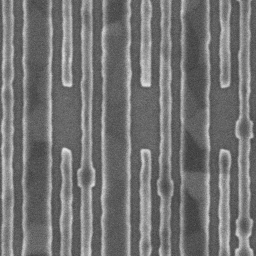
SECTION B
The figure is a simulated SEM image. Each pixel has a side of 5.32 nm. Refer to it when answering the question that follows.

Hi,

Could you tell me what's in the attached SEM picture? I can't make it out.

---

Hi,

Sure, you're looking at wiring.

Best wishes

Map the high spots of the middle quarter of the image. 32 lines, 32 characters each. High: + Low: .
++...++...+++++++..+++..+++..+++
++...++...+++++++..+++..+++..+++
++...++...+++++++..+++..+++..+++
++...++...+++++++..+++..+++..+++
++..+++...+++++++..+++..+++..+++
....+++...++++++........+++..+++
....+++...+++++++.......+++..+++
.....++...+++++++.......+++..+++
.....++...++++++........+++..+++
.....++...++++++........+++..+++
.....++...+++++++.......+++..+++
.....++...+++++++.......+++..+++
.....++...++++++........+++..+++
.....++...++++++........+++..+++
.....++...+++++++.......+++..+++
....+++...++++++........+++..+++
.....++...++++++........+++..+++
.....++..+++++++........+++..+++
.....++...++++++........+++..+++
.....++...+++++++.......+++..+++
.....++...+++++++.......+++..+++
+....++...+++++++..++...+++..+++
++...++...+++++++..+++..+++..+++
++..+++...++++++...+++..+++..+++
++..+++...++++++...+++..+++..+++
++..+++...++++++...+++..+++..+++
++.+++++..++++++...+++..+++..+++
++.+++++..+++++++..+++..+++..+++
++.+++++..+++++++..+++..+++..+++
++.+++++..++++++...++..++++..+++
++..+++...++++++...+++.++++..+++
++..+++...++++++...+++..+++..+++